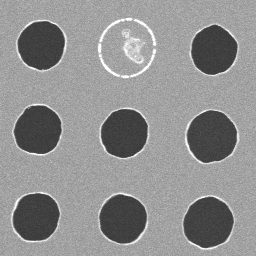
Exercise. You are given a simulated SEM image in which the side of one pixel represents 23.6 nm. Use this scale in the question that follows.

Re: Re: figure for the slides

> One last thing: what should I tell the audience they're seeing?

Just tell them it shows a regular array of holes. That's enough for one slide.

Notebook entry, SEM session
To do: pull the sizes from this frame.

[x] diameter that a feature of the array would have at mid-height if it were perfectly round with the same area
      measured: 1.14 micrometres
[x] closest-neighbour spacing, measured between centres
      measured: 2.02 um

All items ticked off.